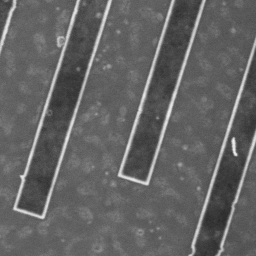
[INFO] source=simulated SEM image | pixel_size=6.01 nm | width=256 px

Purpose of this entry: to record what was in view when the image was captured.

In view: one or a few lines or trenches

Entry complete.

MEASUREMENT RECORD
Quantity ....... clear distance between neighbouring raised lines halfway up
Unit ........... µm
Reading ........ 0.363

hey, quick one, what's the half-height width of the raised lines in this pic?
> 182 nanometers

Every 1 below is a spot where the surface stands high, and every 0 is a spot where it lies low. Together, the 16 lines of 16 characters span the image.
1000011000011000
0000110000110000
0000110000110000
0000110000110000
0000110001100001
0001100001100001
0001100001100001
0001100001000011
0011000011000011
0011000011000011
0011000011000110
0110000000000110
0110000000000110
0000000000000100
0000000000001100
0000000000001100